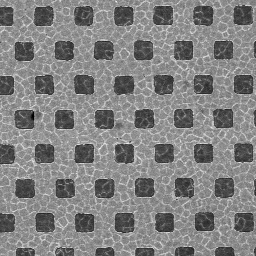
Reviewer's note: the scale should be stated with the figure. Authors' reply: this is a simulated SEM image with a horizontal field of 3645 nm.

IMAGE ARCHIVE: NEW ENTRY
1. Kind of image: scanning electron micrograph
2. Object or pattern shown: a regular array of holes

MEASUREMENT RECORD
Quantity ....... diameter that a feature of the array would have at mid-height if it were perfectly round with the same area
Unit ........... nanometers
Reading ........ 310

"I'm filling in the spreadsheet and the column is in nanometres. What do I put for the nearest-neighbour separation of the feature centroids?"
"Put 561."